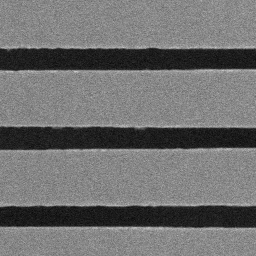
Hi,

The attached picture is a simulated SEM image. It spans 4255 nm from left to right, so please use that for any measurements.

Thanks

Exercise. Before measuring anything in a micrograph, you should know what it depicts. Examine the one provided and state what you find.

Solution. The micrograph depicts lines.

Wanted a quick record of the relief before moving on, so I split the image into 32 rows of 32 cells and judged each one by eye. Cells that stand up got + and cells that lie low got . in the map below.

++++++++++++++++++++++++++++++++
++++++++++++++++++++++++++++++++
++++++++++++++++++++++++++++++++
++++++++++++++++++++++++++++++++
++++++++++++++++++++++++++++++++
++++++++++++++++++++++++++++++++
................................
................................
................................
++++++++++++++++++++++++++++++++
++++++++++++++++++++++++++++++++
++++++++++++++++++++++++++++++++
++++++++++++++++++++++++++++++++
++++++++++++++++++++++++++++++++
++++++++++++++++++++++++++++++++
++++++++++++++++++++++++++++++++
................................
................................
................................
++++++++++++++++++++++++++++++++
++++++++++++++++++++++++++++++++
++++++++++++++++++++++++++++++++
++++++++++++++++++++++++++++++++
++++++++++++++++++++++++++++++++
++++++++++++++++++++++++++++++++
++++++++++++++++++++++++++++++++
................................
................................
++++++++++++++++++++++++..++....
++++++++++++++++++++++++++++++++
++++++++++++++++++++++++++++++++
++++++++++++++++++++++++++++++++